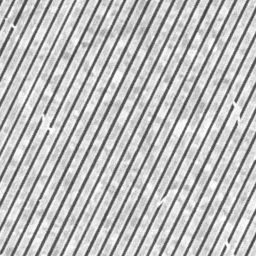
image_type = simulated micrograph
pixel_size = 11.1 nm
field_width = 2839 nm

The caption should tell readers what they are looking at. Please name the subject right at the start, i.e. parallel lines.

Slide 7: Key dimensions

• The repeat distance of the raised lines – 11.1 px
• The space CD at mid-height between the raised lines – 48.6 nm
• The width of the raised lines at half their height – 0.0785 microns